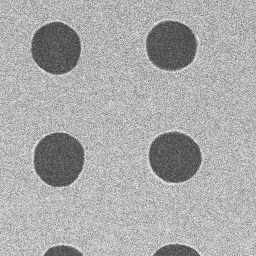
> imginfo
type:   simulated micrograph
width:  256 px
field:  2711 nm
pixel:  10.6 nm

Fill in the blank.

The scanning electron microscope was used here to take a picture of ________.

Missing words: holes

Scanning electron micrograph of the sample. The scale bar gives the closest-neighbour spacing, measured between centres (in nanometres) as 1180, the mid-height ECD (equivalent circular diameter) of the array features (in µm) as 0.55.